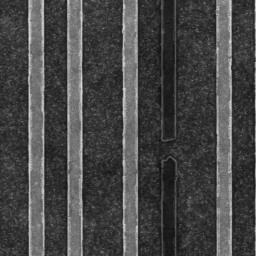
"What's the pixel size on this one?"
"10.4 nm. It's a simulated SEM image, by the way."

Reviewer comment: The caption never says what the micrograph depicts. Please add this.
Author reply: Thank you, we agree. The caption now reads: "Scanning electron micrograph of parallel lines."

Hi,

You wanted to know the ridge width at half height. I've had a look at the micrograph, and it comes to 143 nm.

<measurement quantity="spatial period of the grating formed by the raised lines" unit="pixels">46.9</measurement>